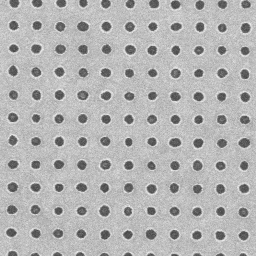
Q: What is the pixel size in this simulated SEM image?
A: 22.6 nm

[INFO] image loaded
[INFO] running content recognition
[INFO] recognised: a regular array of holes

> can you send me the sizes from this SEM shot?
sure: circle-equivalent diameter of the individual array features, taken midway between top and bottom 230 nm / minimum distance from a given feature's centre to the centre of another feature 22.5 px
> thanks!